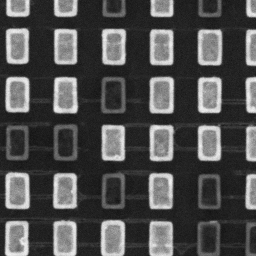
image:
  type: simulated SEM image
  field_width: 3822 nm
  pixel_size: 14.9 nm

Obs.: wiring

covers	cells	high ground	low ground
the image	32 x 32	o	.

.oo....oo....oo....oo....oo....o
.oo....oo....oo....oo....oo....o
................................
................................
.oo....oo....oo....oo....oo....o
.oo....oo....oo....oo....oo....o
.oo....oo....oo....oo....oo....o
.oo....oo....oo....oo....oo....o
................................
................................
.oo....oo....oo....oo....oo....o
.oo....oo....oo....oo....oo....o
.oo....oo....oo....oo....oo....o
.oo....oo....oo....oo....oo....o
................................
................................
.oo....oo....oo....oo....oo....o
.oo....oo....oo....oo....oo....o
.oo....oo....oo....oo....oo....o
.oo....oo....oo....oo....oo....o
................................
................................
.oo....oo....oo....oo....oo....o
.oo....oo....oo....oo....oo....o
.oo....oo....oo....oo....oo....o
.oo....oo....oo....oo....oo....o
................................
................................
.oo....oo....oo....oo....oo....o
.oo....oo....oo....oo....oo....o
.oo....oo....oo....oo....oo....o
.oo....oo....oo....oo....oo....o